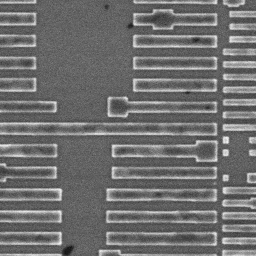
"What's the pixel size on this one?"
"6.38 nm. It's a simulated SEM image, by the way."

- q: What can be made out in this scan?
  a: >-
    wiring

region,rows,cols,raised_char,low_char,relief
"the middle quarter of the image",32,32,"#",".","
..................##############
................................
................................
................................
..................##############
..................##############
..................##############
................................
...........#####................
...........#####................
...........############.########
...........#####################
...........#####................
................................
................................
################################
################################
######.....................#####
................................
................................
............####################
............####################
............####################
................................
................................
................................
............####################
............####################
................................
................................
................................
...........############.########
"